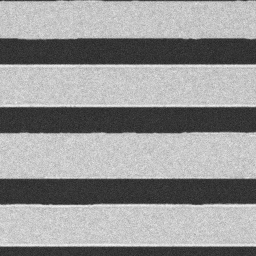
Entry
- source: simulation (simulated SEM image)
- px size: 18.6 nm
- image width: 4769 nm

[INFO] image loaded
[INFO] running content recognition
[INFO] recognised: lines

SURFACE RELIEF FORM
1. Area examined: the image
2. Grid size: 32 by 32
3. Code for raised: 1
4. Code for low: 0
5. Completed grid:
11111111111111111111111111111111
11111111111111111111111111111111
11111111111111111111111111111111
11111111111111111111111111111111
11111111111111111111111111111111
00000000000000000000000000000000
00000000000000000000000000000000
00000000000000000000000000000000
11111111111111111111111111111111
11111111111111111111111111111111
11111111111111111111111111111111
11111111111111111111111111111111
11111111111111111111111111111111
00000000000000000000000000000000
00000000000000000000000000000000
00000000000000000000000000000000
00000000000000000000000000000000
11111111111111111111111111111111
11111111111111111111111111111111
11111111111111111111111111111111
11111111111111111111111111111111
11111111111111111111111111111111
00000000000000000000000000000000
00000000000000000000000000000000
00000000000000000000000000000000
00000000000000000000000000000000
11111111111111111111111111111111
11111111111111111111111111111111
11111111111111111111111111111111
11111111111111111111111111111111
11111111111111111111111111111111
00000000000000000000000000000000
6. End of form